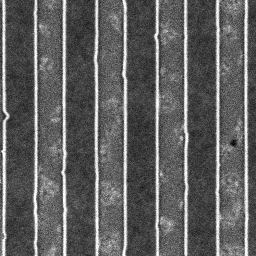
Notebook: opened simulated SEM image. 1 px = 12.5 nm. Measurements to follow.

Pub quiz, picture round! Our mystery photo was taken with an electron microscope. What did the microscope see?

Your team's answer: parallel lines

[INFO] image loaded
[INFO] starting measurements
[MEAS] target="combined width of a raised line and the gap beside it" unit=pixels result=60.6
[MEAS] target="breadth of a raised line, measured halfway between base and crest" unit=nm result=402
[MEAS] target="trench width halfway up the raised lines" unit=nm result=358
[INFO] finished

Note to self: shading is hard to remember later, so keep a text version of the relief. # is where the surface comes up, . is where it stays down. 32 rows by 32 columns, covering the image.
####....####....####...####....#
.###....####....####...####....#
.###....####....####...####....#
.###....####....####...####....#
.###....####....####...####....#
####....####....####...####....#
####....####....####...####....#
####....####....####...####....#
####....####....####...####....#
.###....####....####...####....#
.###....####....####...####....#
.###....####....####...####....#
.###....####....####...####....#
.###....####....####...####....#
.###....####....####...####....#
.####...####....####...####....#
.####...####....####...####....#
.####...####....####...####....#
#####...####....####...####....#
#####...####....####...####....#
.####...####....####...####....#
.####...####....####...####....#
.####...####....####...####....#
.####...####....####...####....#
.###....####....####...####....#
.###....####....####...####....#
####....####....####...####....#
#####...####....####...####....#
#####...####....####...####....#
.####...####....####...####....#
####....####....####...####....#
#####...####....####...####....#